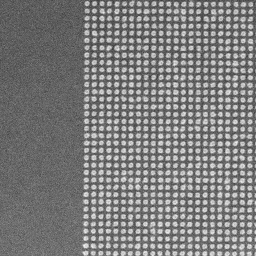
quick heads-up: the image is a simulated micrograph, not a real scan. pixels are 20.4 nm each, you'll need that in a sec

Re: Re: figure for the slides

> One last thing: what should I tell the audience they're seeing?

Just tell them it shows a regular array of raised bodies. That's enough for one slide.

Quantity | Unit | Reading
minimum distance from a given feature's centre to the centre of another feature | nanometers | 144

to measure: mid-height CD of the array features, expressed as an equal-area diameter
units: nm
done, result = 83